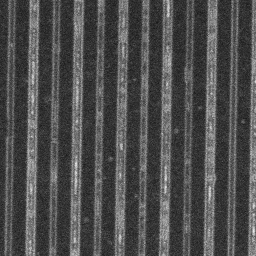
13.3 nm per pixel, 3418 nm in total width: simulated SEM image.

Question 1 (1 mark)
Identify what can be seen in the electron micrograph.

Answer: parallel lines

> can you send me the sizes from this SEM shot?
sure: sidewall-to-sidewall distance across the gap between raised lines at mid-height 63.4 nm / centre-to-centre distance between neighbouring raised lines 0.297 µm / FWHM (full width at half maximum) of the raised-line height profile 215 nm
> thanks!